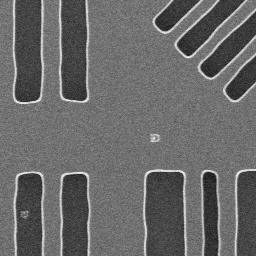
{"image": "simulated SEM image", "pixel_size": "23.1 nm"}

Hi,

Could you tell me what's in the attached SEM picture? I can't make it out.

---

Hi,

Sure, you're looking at groups of lines, slits or small figures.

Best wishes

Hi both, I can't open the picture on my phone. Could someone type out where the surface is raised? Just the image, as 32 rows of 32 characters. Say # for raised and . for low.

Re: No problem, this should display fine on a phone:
##...###...##########....##...##
##...###...#########....##...###
##...###...########....##...###.
##...###...#########..##...###..
##...###...############...##....
##...###...###########...##....#
##...###...############.###...##
##...###...###############...##.
##...###...##############...##..
##...###...###############.##...
##...###...##################...
##...###...#################...#
##...####..##################.##
################################
################################
################################
################################
################################
################################
################################
################################
###################....#######..
##...###...#######.....##..###..
##...###...#######.....##..###..
##...###...#######.....##..###..
##...###...#######.....##..###..
##...###...#######.....##..###..
##...###...#######.....##..###..
##...###...#######.....##..###..
##...###...#######.....##..###..
##...###...#######.....##..##...
##...###...#######.....##..##...